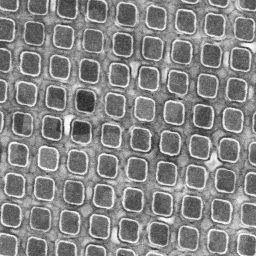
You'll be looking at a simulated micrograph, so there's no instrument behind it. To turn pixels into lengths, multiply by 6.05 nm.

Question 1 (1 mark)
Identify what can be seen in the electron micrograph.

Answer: a regular array of raised bodies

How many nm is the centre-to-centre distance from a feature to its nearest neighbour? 179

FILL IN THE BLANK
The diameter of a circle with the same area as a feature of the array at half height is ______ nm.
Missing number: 140